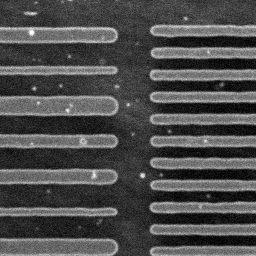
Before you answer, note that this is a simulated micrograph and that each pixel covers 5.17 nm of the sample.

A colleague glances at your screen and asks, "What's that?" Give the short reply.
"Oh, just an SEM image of groups of lines, slits or small figures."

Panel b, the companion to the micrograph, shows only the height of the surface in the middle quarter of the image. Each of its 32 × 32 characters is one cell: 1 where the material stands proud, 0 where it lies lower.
00000000000000000000000000000000
11111111111110000000000000000000
11100110000000000000001111111111
00000000000000000000001111111111
00000000000000000000000000000000
00000000000000000000000000000000
00000000000000000000000000000000
00000000000000000000001111111111
11111111111100000000001111111111
11111111111110000000000000000000
11111111111110000000000000000000
11111111111110000000000000000000
11111111111100000000000000000000
00000000000000000000001111111111
00000000000000000000001111111111
00000000000000000000000000000000
00000000000000000000000000000000
00000000000000000000000000000000
11111111111110000000001111111111
11111111111110000000001111111111
11111111111110000000001110000111
00000000000000000000000000000000
00000000000000000000000000000000
00000000000000000000000000000000
00000000000000000000001111111111
00000000000000000000001111111111
01110000000000000000000000000000
11111111111110000000000000000000
11111111111110000000000000000000
11111111111110000000001111111111
00000000000000000000001111111111
00000000000000000000000011111111